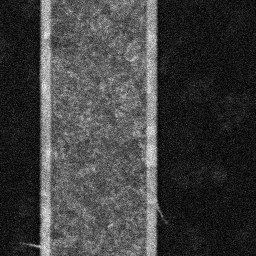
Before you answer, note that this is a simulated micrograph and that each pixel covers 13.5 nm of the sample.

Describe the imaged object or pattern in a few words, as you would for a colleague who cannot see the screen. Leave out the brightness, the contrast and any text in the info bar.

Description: one or a few lines or trenches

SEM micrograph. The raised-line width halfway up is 1420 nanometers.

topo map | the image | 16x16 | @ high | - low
---@@@@@@-------
---@@@@@@-------
---@@@@@@-------
---@@@@@@-------
---@@@@@@-------
---@@@@@@-------
---@@@@@@-------
---@@@@@@-------
---@@@@@@-------
---@@@@@@-------
---@@@@@@-------
---@@@@@@-------
---@@@@@@-------
---@@@@@@-------
---@@@@@@-------
---@@@@@@-------